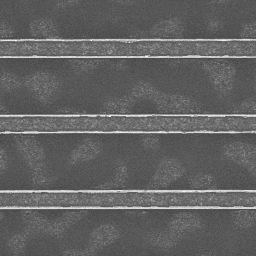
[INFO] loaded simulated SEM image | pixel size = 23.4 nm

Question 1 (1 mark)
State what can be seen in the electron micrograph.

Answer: one or a few lines or trenches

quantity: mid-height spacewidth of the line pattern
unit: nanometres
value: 1360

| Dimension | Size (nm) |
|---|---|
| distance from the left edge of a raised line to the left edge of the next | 1770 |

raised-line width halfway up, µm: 0.412